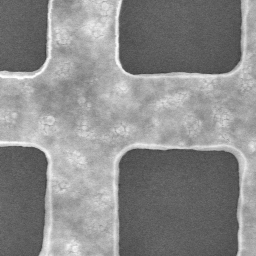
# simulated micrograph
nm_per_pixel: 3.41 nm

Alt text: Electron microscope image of holes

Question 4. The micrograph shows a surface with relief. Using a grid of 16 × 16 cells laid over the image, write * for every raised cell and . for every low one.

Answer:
...*****.......*
...****........*
...****........*
...****........*
..******......**
****************
****************
****************
****************
...*****.......*
...****........*
...****........*
...****........*
...****........*
...****........*
...****........*